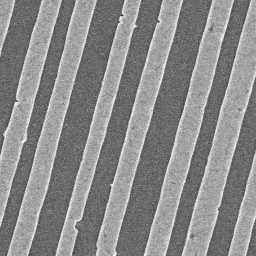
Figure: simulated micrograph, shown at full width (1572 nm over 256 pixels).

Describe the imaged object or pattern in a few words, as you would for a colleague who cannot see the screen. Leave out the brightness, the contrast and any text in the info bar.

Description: parallel lines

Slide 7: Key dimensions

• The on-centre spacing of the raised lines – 256 nm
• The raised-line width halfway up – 117 nm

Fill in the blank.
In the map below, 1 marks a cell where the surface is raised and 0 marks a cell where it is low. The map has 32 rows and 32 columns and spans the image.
11000111011100011000111000111001
11000110011100011000110000111001
10000110011000011000110000111001
10001110011000011001110000010011
10001100111000110001110001110011
00001100111000110001100001110011
00011100110000110001100001100011
00011100110000110011100001100111
00011001110001100011100011100111
00011001100001100011000011100111
00111001100001100111000011000111
00111001100001100111000011001110
00110011100011000110000111001110
00110011000011000110000111001110
01110011000011001110000110011100
01110111000110001110001110011100
01100111000110001100001110011100
01100110000110001100001110011100
11100110000110011100001100111000
11001110001100011000011100111000
11001110001100011000011100111000
11001100001100011000011000111001
11001100001100111000011001110001
10011100011000110000111001110001
10011100011000110000111001110001
10011000011001110000110011100011
10011000110001110001110011100011
00111000110001100001110011100011
00110000100001100001110011100111
00110000110011100001100011000110
01110001100011100011100111000110
01110001100011000011100111000110